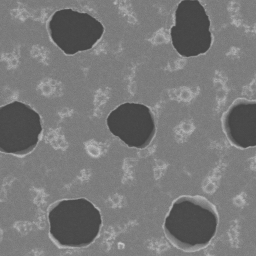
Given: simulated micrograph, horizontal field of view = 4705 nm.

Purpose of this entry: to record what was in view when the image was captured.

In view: holes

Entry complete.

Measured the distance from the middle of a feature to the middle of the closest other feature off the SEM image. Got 2.06 um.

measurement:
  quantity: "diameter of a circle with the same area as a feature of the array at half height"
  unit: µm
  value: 0.883